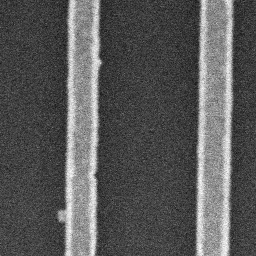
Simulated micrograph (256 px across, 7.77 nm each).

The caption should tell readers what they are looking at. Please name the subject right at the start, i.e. one or a few lines or trenches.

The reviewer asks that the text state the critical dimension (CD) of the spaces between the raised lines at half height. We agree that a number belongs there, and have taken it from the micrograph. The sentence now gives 829 nm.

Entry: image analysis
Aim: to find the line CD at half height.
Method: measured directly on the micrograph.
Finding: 202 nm